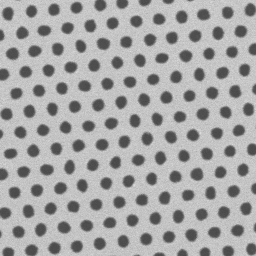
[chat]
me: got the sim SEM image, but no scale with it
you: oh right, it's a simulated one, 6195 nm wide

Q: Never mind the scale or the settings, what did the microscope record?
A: a regular array of holes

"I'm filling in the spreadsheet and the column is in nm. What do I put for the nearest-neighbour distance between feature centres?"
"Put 540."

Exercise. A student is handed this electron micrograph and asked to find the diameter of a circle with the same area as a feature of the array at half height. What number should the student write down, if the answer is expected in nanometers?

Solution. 306